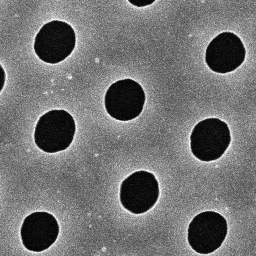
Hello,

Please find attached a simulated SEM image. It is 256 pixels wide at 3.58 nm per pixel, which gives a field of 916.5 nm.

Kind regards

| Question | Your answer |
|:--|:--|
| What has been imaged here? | a regular array of holes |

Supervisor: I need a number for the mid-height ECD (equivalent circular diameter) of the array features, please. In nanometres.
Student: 148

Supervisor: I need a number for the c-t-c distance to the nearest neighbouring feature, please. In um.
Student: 0.298